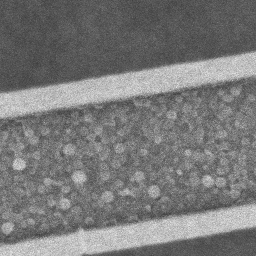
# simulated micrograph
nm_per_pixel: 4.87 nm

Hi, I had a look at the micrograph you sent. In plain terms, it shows one or a few lines or trenches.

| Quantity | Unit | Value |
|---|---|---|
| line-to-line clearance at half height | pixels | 150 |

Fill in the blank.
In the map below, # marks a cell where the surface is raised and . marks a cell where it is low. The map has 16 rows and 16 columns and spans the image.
################
################
################
################
#############...
#######.........
#...............
................
................
................
................
................
................
................
..........######
....############